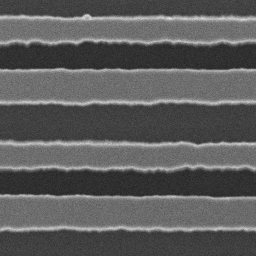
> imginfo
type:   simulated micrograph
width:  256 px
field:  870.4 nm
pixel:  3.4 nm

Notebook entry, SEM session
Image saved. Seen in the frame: lines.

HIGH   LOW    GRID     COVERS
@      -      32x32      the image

--------------------------------
--------------------------------
@@@@@@@@@@@@@@@@@@@@@@@@@@@@@@@@
@@@@@@@@@@@@@@@@@@@@@@@@@@@@@@@@
@@@@@@@@@@@@@@@@@@@@@@@@@@@@@@@@
--------------------------------
--------------------------------
--------------------------------
--------------------------------
@@@@@@@@@@@@@@@@@@@@@@@@@@@@@@@@
@@@@@@@@@@@@@@@@@@@@@@@@@@@@@@@@
@@@@@@@@@@@@@@@@@@@@@@@@@@@@@@@@
@@@@@@@@@@@@@@@@@@@@@@@@@@@@@@@@
--------------------------------
--------------------------------
--------------------------------
--------------------------------
--------------------------------
@@@@@@@@@@@@@@@@@@@@@@@@@@@@@@@@
@@@@@@@@@@@@@@@@@@@@@@@@@@@@@@@@
@@@@@@@@@@@@@@@@@@@@@@@@@@@@@@@@
--------------------------------
--------------------------------
--------------------------------
@@@@@@@@@@@@-------@-@----------
@@@@@@@@@@@@@@@@@@@@@@@@@@@@@@@@
@@@@@@@@@@@@@@@@@@@@@@@@@@@@@@@@
@@@@@@@@@@@@@@@@@@@@@@@@@@@@@@@@
@@@@@@@--@@@@@@@@@@@@@@@@@@@@@@@
--------------------------------
--------------------------------
--------------------------------